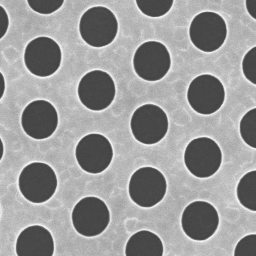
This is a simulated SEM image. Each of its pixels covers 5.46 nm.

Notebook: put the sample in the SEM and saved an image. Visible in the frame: a regular array of holes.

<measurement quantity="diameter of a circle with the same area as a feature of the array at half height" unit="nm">210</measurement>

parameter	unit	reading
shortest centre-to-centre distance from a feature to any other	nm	343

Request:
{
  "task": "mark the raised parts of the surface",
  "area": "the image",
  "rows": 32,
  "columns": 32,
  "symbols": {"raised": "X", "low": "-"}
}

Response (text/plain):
XXXX----XXXXXXXXX-----XXXXXXXXX-
-XXXX--XXXX---XXXX---XXXXXXXXXX-
-XXXXXXXXX-----XXXXXXXXX----XXXX
-XXXXXXXXX-----XXXXXXXXX----XXXX
XXXXXXXXXX----XXXXXXXXXX----XXXX
XXXX---XXXX---XXXX--XXXX----XXXX
XXX-----XXXXXXXXX----XXXXXXXXXX-
XXX-----XXXXXXXXX----XXXXXXXXX--
XXX----XXXXXXXXXX----XXXXXXXXX--
XXXXX-XXXXX---XXX---XXXXX--XXXX-
-XXXXXXXXX----XXXXXXXXXX----XXXX
XXXXXXXXXX----XXXXXXXXX-----XXXX
XXXXXXXXXX----XXXXXXXXXX----XXXX
XXX----XXXX--XXXX---XXXX---XXXXX
XXX----XXXXXXXXXX----XXXXXXXXX--
XXX----XXXXXXXXX-----XXXXXXXXX--
XXX----XXXXXXXXXX----XXXXXXXXX--
XXXXXXXXXX---XXXX---XXXX--XXXX--
XXXXXXXXXX----XXXXXXXXX----XXXXX
XXXXXXXXXX----XXXXXXXXX-----XXXX
XXXX--XXXX----XXXXXXXXX-----XXXX
XXX----XXXX--XXXX---XXXX---XXXX-
XX-----XXXXXXXXX-----XXXXXXXXX--
XX-----XXXXXXXXX-----XXXXXXXXX--
XXX---XXXXXXXXXX----XXXXXXXXXX--
XXXXXXXXXX---XXXX--XXXXX--XXXX--
XXXXXXXXX-----XXXXXXXXX----XXXXX
XXXXXXXXX-----XXXXXXXXX----XXXXX
XXX--XXXX----XXXXXXXXXX----XXXXX
XX----XXXXX-XXXXX---XXXX--XXXXX-
XX-----XXXXXXXXX----XXXXXXXXXX--
XX-----XXXXXXXXX----XXXXXXXXX---